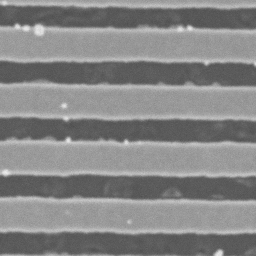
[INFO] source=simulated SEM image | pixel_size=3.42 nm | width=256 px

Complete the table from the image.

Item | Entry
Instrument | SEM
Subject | lines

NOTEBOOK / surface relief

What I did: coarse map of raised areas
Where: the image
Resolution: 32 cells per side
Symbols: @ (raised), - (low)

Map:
@@@@@@@@@@@@@@@@@@@@@@@@@@@@@@@@
--------------------------------
--------------------------------
@@@@@@@@--------------@@--------
@@@@@@@@@@@@@@@@@@@@@@@@@@@@@@@@
@@@@@@@@@@@@@@@@@@@@@@@@@@@@@@@@
@@@@@@@@@@@@@@@@@@@@@@@@@@@@@@@@
@@@@@@@@@@@@@@@@@@@@@@@@@@@@@@@@
--------------------------------
--------------------------------
@@@@@@@-------------------------
@@@@@@@@@@@@@@@@@@@@@@@@@@@@@@@@
@@@@@@@@@@@@@@@@@@@@@@@@@@@@@@@@
@@@@@@@@@@@@@@@@@@@@@@@@@@@@@@@@
@@@@@@@@@@@@@@@@@@@@@@@@@@@@@@@@
--------------------------------
--------------------------------
--------@-----------------------
@@@@@@@@@@@@@@@@@@@@@@@@@@@@@@@@
@@@@@@@@@@@@@@@@@@@@@@@@@@@@@@@@
@@@@@@@@@@@@@@@@@@@@@@@@@@@@@@@@
@@@@@@@@@@@@@@@@@@@@@@@@@@@@@@@@
--------------------------------
--------------------------------
--------------------------------
@@@@@@@@@@@@@@@@@@@@@@@@@@@@@@@@
@@@@@@@@@@@@@@@@@@@@@@@@@@@@@@@@
@@@@@@@@@@@@@@@@@@@@@@@@@@@@@@@@
@@@@@@@@@@@@@@@@@@@@@@@@@@@@@@@@
--------------------------------
--------------------------------
---------------------------@----